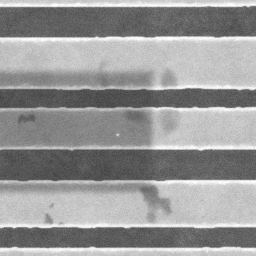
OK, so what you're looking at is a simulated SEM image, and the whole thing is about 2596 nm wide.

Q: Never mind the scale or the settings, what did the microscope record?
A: lines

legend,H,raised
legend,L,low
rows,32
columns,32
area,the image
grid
HHHHHHHHHHHHHHHHHHHHHHHHHHHHHHHH
LLLLLLLLLLLLLLLLLLLLLLLLLLLLLLLL
LLLLLLLLLLLLLLLLLLLLLLLLLLLLLLLL
LLLLLLLLLLLLLLLLLLLLLLLLLLLLLLLL
LLLLLLLLLLLLLLLLLLLLLLLLLLLLLLLL
HHHHHHHHHHHHHHHHHHHHHHHHHHHHHHHH
HHHHHHHHHHHHHHHHHHHHHHHHHHHHHHHH
HHHHHHHHHHHHHHHHHHHHHHHHHHHHHHHH
HHHHHHHHHHHHHHHHHHHHHHHHHHHHHHHH
HHHHHHHHHHHHHHHHHHHHHHHHHHHHHHHH
HHHHHHHHHHHHHHHHHHHHHHHHHHHHHHHH
LLLLLLLLLLLLLLLLLLLLLLLLLLLLLLLL
LLLLLLLLLLLLLLLLLLLLLLLLLLLLLLLL
LLLLHHLLLLHHLLHHLLHHHLLLLLHHLHHH
HHHHHHHHHHHHHHHHHHHHHHHHHHHHHHHH
HHHHHHHHHHHHHHHHHHHHHHHHHHHHHHHH
HHHHHHHHHHHHHHHHHHHHHHHHHHHHHHHH
HHHHHHHHHHHHHHHHHHHHHHHHHHHHHHHH
HHHHHHHHHHHHHHHHHHHHHHHHHHHHHHHH
LLLLLLLLLLLLLLLLLLLLLLLLLLLLLLLL
LLLLLLLLLLLLLLLLLLLLLLLLLLLLLLLL
LLLLLLLLLLLLLLLLLLLLLLLLLLLLLLLL
LLLLLLLLLLLLLLLLLLLLLLLLLLLLLLLL
HHHHHHHHHHHHHHHHHHHHHHHHHHHHHHHH
HHHHHHHHHHHHHHHHHHHHHHHHHHHHHHHH
HHHHHHHHHHHHHHHHHHHHHHHHHHHHHHHH
HHHHHHHHHHHHHHHHHHHHHHHHHHHHHHHH
HHHHHHHHHHHHHHHHHHHHHHHHHHHHHHHH
LLLLLLLLLLLLLLLLLLLLLLLLLLLLLLLL
LLLLLLLLLLLLLLLLLLLLLLLLLLLLLLLL
LLLLLLLLLLLLLLLLLLLLLLLLLLLLLLLL
HHHHHHHHHHHHHHHHHHHHHHHHHHHHHHHH